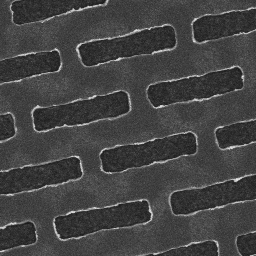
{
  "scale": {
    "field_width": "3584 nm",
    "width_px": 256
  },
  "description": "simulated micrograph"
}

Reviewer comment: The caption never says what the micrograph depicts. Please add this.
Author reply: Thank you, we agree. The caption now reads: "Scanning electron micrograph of holes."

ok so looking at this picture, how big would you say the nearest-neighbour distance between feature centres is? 1.12 microns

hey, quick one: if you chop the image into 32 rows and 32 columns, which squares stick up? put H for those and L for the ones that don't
HHLLLLLLLLLLLHHHHHHHHHHHHHHHHHHH
HHLLLLLLHHHHHHHHHHHHHHHHHHHHHLLL
HHLLLHHHHHHHHHHHHHHHHHHHHLLLLLLL
HHHHHHHHHHHHHHHHHHHLLLHHLLLLLLLL
HHHHHHHHHHHHHHHHLLLLLLHHLLLLLHHH
HHHHHHHHHHLLLLLLLLLLLLHHHHHHHHHH
HHHHHHLHHHLLLLLLLLLHHHHHHHHHHHHH
LLLLLLLLHHLLLLHHHHHHHHHHHHHHHHHH
LLLLLLLHHHHHHHHHHHHHHHHHHHHHHLHH
LLLLHHHHHHHHHHHHHHHHHHHHHLLLLLHH
HHHHHHHHHHHHHHHHHHHLLLLLLLLLLLHH
HHHHHHHHHHHHHHLHHHLLLLLLLLLLLHHH
HHHHHHHHHHHLLLLLHHHLLLLLHHHHHHHH
HHHHHLLLLLLLLLLLHHHHHHHHHHHHHHHH
LHHHLLLLLLLLLLLHHHHHHHHHHHHHHHHH
LLHHLLLLLLHHHHHHHHHHHHHHHHHHHLLL
LLHHHHHHHHHHHHHHHHHHHHHHHHHLLLLL
LHHHHHHHHHHHHHHHHHHLLLLLHHHLLLLL
HHHHHHHHHHHHHHLLLLLLLLLLLHHHHHHH
HHHHHHHHHHHHHLLLLLLLLLLHHHHHHHHH
HHHHHLLLLLHHHLLLLLLHHHHHHHHHHHHH
LLLLLLLLLLHHHLLHHHHHHHHHHHHHHHHH
LLLLLLLLLHHHHHHHHHHHHHHHHHHHHHLL
LLLLLHHHHHHHHHHHHHHHHHHHHLLLLLLL
HHHHHHHHHHHHHHHHHHHHHLLLLLLLLLLL
HHHHHHHHHHHHHHHLLLHHHLLLLLLLLHHH
HHHHHHHHHHLLLLLLLLLHHHLLHHHHHHHH
HHHHHHHLLLLLLLLLLLLHHHHHHHHHHHHH
LLLLHHHLLLLLLLHHHHHHHHHHHHHHHHHH
LLLLLHHLLLHHHHHHHHHHHHHHHHHHHHLL
LLLLHHHHHHHHHHHHHHHHHHHHLLLHHHLL
HHHHHHHHHHHHHHHHHHHHHLLLLLLHHHLL